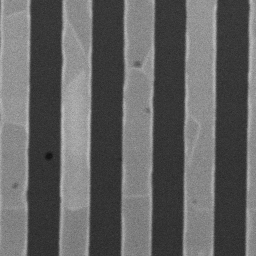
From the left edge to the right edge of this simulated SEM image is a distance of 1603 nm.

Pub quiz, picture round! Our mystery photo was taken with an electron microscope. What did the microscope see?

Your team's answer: wiring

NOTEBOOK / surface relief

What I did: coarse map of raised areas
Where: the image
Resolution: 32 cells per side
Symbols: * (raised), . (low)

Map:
****....***.....***....****....*
****....***.....***....****....*
****....***.....***....****....*
****....***.....***....****....*
****....***.....***....****....*
****....***.....***.....***....*
****....***.....***....****....*
****....***.....***....****....*
****....***.....***....****....*
****....***.....***....****....*
****....***.....***....****....*
****....***....****....****....*
****....***....****....****....*
***.....***.....***....****....*
***.....***.....***....****....*
***.....***....****....****....*
***.....***....****....****....*
***.....***....****....****....*
***.....***....****....****....*
***.....***....****....****....*
***.....***....****....****....*
***.....***....****....****....*
***.....***....****....****....*
***.....***....****....****....*
***.....***....****....****....*
***.....***....****....****....*
***.....***....****....****....*
***.....***....****....****....*
***.....***....****....****....*
***.....***....****....****....*
***.....***....****....****....*
***.....***....****....***.....*